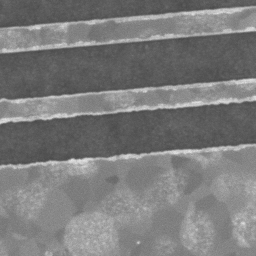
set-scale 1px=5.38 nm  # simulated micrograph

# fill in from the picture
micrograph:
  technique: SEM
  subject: one or a few lines or trenches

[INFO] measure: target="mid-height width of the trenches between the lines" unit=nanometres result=247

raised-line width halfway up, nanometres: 124